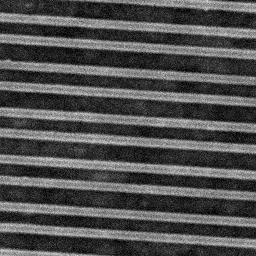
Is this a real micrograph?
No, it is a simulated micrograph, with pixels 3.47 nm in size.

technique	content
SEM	parallel lines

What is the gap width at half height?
62.4 nm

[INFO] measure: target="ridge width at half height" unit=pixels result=7.75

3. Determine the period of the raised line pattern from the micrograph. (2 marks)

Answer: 23.4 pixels